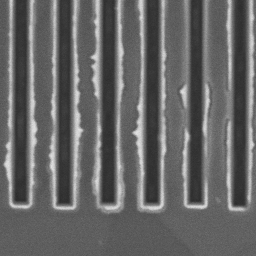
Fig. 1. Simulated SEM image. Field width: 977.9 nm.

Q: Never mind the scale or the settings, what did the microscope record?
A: parallel lines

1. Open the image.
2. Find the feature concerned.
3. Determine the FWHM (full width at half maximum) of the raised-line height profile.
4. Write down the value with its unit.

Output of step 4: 115 nm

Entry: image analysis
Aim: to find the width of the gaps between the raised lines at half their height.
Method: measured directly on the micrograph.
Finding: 0.0521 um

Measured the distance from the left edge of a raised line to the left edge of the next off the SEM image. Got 167 nm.